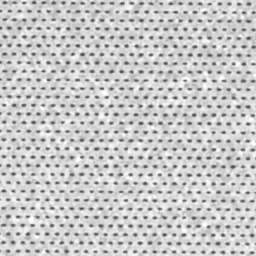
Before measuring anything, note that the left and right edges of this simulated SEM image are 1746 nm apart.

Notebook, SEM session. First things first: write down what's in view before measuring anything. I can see a regular array of holes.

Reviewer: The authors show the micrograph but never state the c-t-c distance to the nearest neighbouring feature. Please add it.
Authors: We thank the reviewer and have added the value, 63.7 nm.